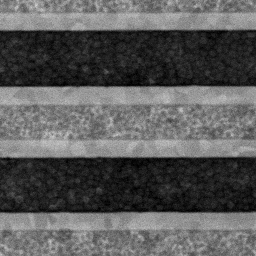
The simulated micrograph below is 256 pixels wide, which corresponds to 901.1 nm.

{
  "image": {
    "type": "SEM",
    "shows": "one or a few lines or trenches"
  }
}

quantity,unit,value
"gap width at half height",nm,263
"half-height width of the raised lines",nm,182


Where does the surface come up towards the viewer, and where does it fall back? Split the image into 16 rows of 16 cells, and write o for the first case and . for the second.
oooooooooooooooo
................
................
................
................
................
oooooooooooooooo
oooooooooooooooo
oooooooooooooooo
................
................
................
................
................
oooooooooooooooo
oooooooooooooooo